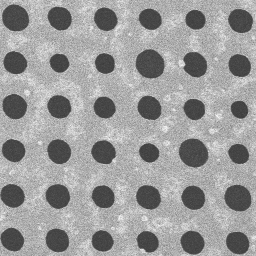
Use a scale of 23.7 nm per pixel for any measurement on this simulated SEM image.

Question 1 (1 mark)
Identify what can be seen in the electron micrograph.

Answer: a regular array of holes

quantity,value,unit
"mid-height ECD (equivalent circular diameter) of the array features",559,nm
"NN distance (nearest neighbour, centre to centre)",1050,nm